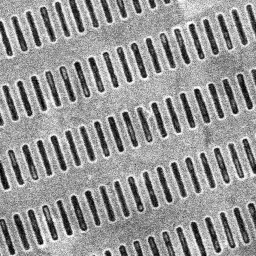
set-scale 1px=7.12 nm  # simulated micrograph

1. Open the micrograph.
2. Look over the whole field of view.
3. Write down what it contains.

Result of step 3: a regular array of holes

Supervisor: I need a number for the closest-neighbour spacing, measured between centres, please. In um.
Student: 0.107